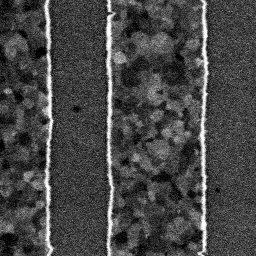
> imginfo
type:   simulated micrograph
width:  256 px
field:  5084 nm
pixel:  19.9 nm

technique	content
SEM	one or a few lines or trenches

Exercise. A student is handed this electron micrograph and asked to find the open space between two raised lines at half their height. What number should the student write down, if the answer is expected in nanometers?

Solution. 1200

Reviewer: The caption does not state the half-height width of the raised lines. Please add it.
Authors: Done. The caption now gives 1.87 microns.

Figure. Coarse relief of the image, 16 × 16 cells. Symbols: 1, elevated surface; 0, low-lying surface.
1110000111111000
1110000111111000
1110000111111000
1110000111111000
1110000111111000
1110000111111000
1110000111111000
1110000111111000
1110000111111000
1110000111111000
1110000111111000
1110000111111000
1110000111111000
1110000111111000
1110000111111000
1110000111111000